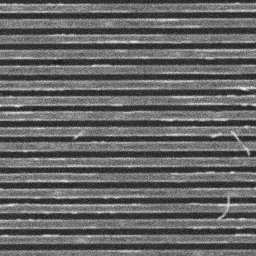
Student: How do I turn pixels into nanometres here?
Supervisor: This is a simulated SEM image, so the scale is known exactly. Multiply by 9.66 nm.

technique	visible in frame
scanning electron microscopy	parallel lines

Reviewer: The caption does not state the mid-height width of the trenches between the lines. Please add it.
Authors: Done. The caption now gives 67.6 nanometers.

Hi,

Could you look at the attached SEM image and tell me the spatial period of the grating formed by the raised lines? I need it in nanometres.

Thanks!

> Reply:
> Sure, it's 149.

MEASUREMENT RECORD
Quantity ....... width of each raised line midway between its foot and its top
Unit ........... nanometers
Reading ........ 84.5